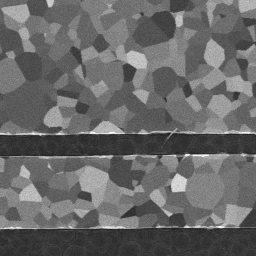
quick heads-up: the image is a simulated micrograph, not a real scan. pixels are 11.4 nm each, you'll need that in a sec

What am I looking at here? one or a few lines or trenches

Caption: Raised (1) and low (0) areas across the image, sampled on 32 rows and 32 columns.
11111111111111111111111111111111
11111111111111111111111111111111
11111111111111111111111111111111
11111111111111111111111111111111
11111111111111111111111111111111
11111111111111111111111111111111
11111111111111111111111111111111
11111111111111111111111111111111
11111111111111111111111111111111
11111111111111111111111111111111
11111111111111111111111111111111
11111111111111111111111111111111
11111111111111111111111111111111
11111111111111111111111111111111
11111111111111111111111111111111
11111111111111111111111111111111
11111111111111111111111111111111
00000000000000000000000000000000
00000000000000000000000000000000
00000000110110001101111111111111
11111111111111111111111111111111
11111111111111111111111111111111
11111111111111111111111111111111
11111111111111111111111111111111
11111111111111111111111111111111
11111111111111111111111111111111
11111111111111111111111111111111
11111111111111111111111111111111
11111111111111111000000000000000
00000000000010000000001000000000
00000000000010001000001000000000
00000000111000011000000000110000